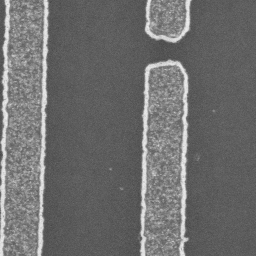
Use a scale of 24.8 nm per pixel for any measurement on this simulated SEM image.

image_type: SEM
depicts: one or a few lines or trenches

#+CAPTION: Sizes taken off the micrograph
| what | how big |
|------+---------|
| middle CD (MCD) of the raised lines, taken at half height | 967 nanometers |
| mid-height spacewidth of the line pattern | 2530 nanometers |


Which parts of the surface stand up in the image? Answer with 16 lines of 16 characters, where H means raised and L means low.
HHHLLLLLLHHHLLLL
HHHLLLLLLHHHLLLL
HHHLLLLLLLLLLLLL
HHHLLLLLLLLLLLLL
HHHLLLLLLHHLLLLL
HHHLLLLLLHHHLLLL
HHHLLLLLLHHHLLLL
HHHLLLLLLHHHLLLL
HHHLLLLLLHHHLLLL
HHHLLLLLLHHLLLLL
HHHLLLLLLHHLLLLL
HHHLLLLLLHHLLLLL
HHHLLLLLLHHLLLLL
HHHLLLLLLHHLLLLL
HHHLLLLLLHHLLLLL
HHHLLLLLLHHLLLLL